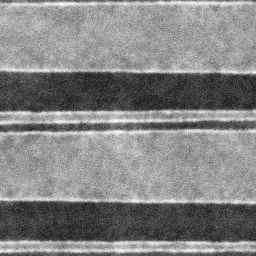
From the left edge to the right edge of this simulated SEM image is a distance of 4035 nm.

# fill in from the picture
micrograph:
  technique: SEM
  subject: lines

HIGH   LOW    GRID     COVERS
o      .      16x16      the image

oooooooooooooooo
oooooooooooooooo
oooooooooooooooo
oooooooooooooooo
..............oo
................
................
oooooooooooooooo
oooooooooooooooo
oooooooooooooooo
oooooooooooooooo
oooooooooooooooo
.....ooooooooooo
................
................
oooooooooooooooo